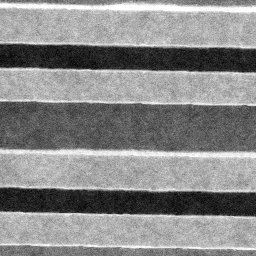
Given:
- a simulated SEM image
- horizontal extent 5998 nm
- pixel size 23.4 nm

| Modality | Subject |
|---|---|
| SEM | lines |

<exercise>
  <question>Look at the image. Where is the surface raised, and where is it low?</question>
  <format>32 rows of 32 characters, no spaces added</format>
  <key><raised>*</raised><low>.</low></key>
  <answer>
................................
*******************************.
********************************
********************************
********************************
..........**********************
................................
................................
................................
********************************
********************************
********************************
********************************
................................
................................
................................
................................
................................
................................
**************************......
********************************
********************************
********************************
.......*************************
................................
................................
................................
********************************
********************************
********************************
********************************
................................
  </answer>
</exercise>